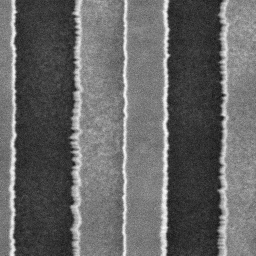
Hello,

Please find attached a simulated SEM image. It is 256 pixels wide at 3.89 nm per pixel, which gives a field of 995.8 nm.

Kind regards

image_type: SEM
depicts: lines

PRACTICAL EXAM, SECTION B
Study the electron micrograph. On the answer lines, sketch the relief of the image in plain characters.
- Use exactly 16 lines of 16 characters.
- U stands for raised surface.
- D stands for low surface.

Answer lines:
UDDDDUUUUUDDDDUU
UDDDDUUUUUDDDDUU
UDDDDUUUUUDDDDUU
UDDDDUUUUUDDDDUU
UDDDDUUUUUDDDDUU
UDDDDUUUUUDDDDUU
UDDDDUUUUUDDDDUU
UDDDDUUUUUDDDDUU
UDDDDUUUUUDDDDUU
UDDDDUUUUUDDDDUU
UDDDDUUUUUDDDDUU
UDDDDUUUUUDDDDUU
UDDDDUUUUUDDDDUU
UDDDDUUUUUDDDDUU
UDDDDUUUUUDDDDUU
UDDDDUUUUUDDDDUU